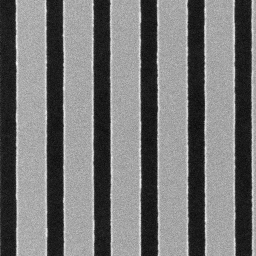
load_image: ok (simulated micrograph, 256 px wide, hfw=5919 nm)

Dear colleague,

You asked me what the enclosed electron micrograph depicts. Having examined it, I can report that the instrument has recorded parallel lines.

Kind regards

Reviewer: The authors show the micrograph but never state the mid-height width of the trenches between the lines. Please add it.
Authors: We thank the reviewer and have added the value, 405 nm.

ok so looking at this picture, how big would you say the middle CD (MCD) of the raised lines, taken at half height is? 691 nm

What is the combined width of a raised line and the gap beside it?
1090 nm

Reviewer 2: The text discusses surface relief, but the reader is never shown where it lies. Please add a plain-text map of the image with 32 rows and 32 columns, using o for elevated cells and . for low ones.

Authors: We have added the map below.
..oooo..oooo..ooo...ooo...ooo...
..oooo..oooo..oooo..ooo...ooo...
..oooo..oooo..oooo..ooo...ooo..o
..oooo..oooo..ooo...ooo...ooo...
..oooo..oooo..ooo...ooo...ooo...
..oooo..oooo..ooo...ooo...ooo...
..oooo..oooo..ooo...ooo...ooo..o
..oooo..oooo..ooo...ooo...ooo...
..oooo..oooo..oooo..ooo...ooo...
..oooo..oooo..ooo...ooo...ooo...
..oooo..oooo..ooo...ooo...ooo...
..oooo..oooo..ooo...ooo...ooo...
..oooo..oooo..ooo...ooo...ooo...
..oooo..oooo..oooo..ooo...ooo...
..oooo..oooo..oooo..ooo...ooo...
..oooo..oooo..oooo..ooo...ooo...
..oooo..oooo..oooo..ooo...ooo...
..oooo..oooo..oooo..ooo...ooo...
..oooo..oooo..oooo..ooo...ooo...
..oooo..oooo..oooo..ooo...ooo...
..oooo..oooo..oooo..ooo...ooo...
..oooo..oooo..oooo..ooo...ooo...
..oooo..oooo..oooo..ooo...ooo...
..oooo..oooo..oooo..ooo...ooo...
..oooo..oooo..oooo..ooo...ooo...
..oooo..oooo..ooo...ooo...ooo...
..oooo..oooo..oooo..ooo...ooo...
..oooo..oooo..oooo..ooo...ooo...
..oooo..oooo..oooo..ooo...ooo...
..oooo..oooo..oooo..ooo...ooo...
..oooo..oooo..ooo...ooo...ooo...
..oooo..oooo..oooo..ooo...ooo...